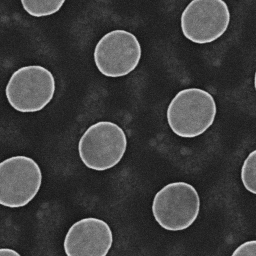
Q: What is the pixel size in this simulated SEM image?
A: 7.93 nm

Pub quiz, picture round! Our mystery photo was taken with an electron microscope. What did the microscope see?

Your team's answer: raised bodies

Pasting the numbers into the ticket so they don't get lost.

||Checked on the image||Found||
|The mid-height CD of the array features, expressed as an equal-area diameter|0.367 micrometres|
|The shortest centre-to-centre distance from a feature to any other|0.741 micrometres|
